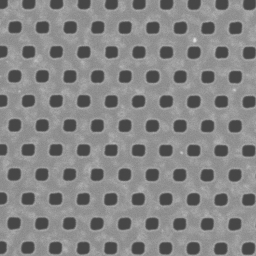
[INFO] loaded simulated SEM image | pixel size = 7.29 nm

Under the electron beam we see a regular array of holes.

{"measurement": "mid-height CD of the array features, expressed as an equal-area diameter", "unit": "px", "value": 13.9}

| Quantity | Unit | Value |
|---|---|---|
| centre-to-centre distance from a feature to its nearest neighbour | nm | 199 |